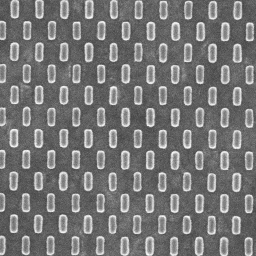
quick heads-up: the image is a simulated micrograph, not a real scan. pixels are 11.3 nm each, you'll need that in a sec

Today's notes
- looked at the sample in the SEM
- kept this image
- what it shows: a regular array of raised bodies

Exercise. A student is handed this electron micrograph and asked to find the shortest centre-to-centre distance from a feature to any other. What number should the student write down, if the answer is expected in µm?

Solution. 0.277